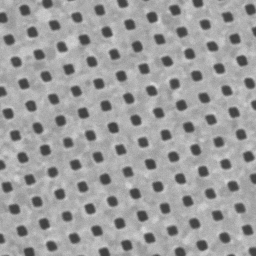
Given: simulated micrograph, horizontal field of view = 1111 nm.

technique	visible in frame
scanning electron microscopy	a regular array of holes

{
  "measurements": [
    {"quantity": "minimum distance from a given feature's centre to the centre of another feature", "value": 99.9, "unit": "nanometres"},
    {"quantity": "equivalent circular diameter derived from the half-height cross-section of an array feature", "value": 53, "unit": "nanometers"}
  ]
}